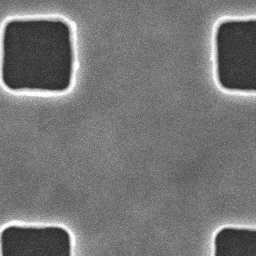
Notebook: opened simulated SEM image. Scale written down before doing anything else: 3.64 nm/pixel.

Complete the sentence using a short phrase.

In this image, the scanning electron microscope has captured holes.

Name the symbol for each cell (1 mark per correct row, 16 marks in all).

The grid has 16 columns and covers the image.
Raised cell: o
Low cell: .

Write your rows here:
oooooooooooooooo
....oooooooooo..
.....oooooooo...
.....oooooooo...
.....ooooooooo..
o...oooooooooo..
oooooooooooooooo
oooooooooooooooo
oooooooooooooooo
oooooooooooooooo
oooooooooooooooo
oooooooooooooooo
oooooooooooooooo
oooooooooooooooo
....oooooooooo..
....ooooooooo...